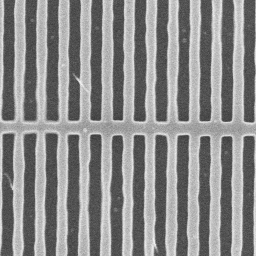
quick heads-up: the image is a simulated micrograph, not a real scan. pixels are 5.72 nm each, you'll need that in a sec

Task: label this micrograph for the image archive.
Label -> groups of lines, slits or small figures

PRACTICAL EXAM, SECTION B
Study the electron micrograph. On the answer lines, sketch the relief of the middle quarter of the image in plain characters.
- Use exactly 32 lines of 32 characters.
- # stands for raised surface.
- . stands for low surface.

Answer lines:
#...###...##...##....##...##...#
#...###...##...##....##...##...#
#...###...##...##....##...##...#
#...###...##...##....##...##...#
#...###...##...##....##...##...#
#...###...##...##....##...##...#
#...###...##...##....#....##...#
#...###...##...##....##...##...#
#...###...##...##....##...##...#
#...###...##...##....##...##...#
#...###...##...##....##...##...#
#...###..###...##....##...##...#
#...###..###...##....##...##...#
#...###..###...##....##...##...#
##.###############..###..####..#
################################
################################
##.####.########################
#...##....##...##...###...##...#
#...##....##...##....##...##...#
#...##....##...##....##...##...#
#...##....##...##....##...##...#
#...###...##...##...##....##...#
#...###..###...##...##....##...#
#...##...###...##...###...##...#
#...##...###...##....##...##...#
#...##...###...##...###...##...#
#...##...###...##...###...##...#
#...##...###...##...###...##...#
#...##....##...##...###...##...#
#...##....##...##...##....##...#
#...##....#....##...###...##...#